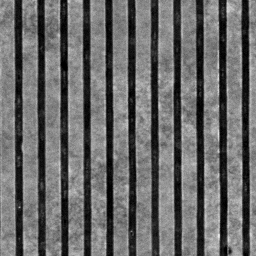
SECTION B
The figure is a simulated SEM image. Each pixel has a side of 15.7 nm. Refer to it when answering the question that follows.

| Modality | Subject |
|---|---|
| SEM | parallel lines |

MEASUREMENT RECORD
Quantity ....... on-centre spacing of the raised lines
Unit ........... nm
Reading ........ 356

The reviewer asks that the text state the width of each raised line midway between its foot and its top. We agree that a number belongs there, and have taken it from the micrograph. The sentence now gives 228 nm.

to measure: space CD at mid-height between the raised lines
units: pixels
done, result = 7.75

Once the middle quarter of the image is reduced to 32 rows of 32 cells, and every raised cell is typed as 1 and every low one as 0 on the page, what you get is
01111001110011110011110011100111
01111001110011110011110011100111
01111001110011110011110011100111
01111001110011110011110011100111
01111001110011110011110011100111
01111001110011110011110011100111
01111001110011110011110011100111
01111001110011110011110011100111
01111001110011110011110011100111
01111001110011110011110011100111
01111001110011110011110011100011
01111001110011110011110011100011
01111001110011110011110011100011
01111001110011110011110011100011
01111001110011110011110011100011
01111001110011110011110011100011
01111001110011110011110011100011
01111001110011110011110011100011
01111001110011110011110011100011
01111001110011110011110011100011
01111001110011110011110011100011
01111001110011110011110011100011
01111001111011110011110011100011
01111001111011110011110011100011
01111001111011110011110011100011
01111001111011110011110011100011
01111001111011110011110011100011
01111001111011110011110011100011
01111001111011110011110011100011
01111001111011110011110011100011
01111001111011110011110011100011
01111001111011110011110011100011